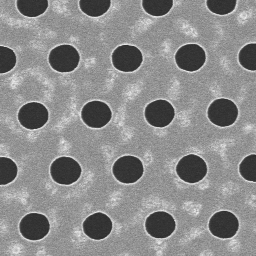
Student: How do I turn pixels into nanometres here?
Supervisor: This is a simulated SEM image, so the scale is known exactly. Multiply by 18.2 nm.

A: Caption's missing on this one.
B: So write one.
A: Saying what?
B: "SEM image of a regular array of holes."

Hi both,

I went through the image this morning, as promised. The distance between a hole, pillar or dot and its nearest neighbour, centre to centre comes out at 1140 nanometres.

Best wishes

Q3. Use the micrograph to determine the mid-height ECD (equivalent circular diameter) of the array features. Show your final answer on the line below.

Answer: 527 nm